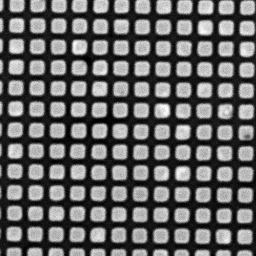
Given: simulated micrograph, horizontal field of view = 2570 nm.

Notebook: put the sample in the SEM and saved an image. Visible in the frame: a regular array of raised bodies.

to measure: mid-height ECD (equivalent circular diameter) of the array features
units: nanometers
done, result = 156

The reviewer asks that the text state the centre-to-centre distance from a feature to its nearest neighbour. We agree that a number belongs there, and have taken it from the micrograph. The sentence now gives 207 nm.